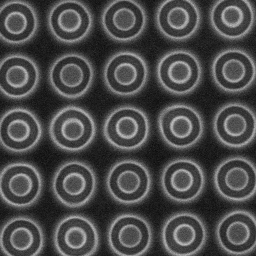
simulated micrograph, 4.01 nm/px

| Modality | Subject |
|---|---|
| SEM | an array of small figures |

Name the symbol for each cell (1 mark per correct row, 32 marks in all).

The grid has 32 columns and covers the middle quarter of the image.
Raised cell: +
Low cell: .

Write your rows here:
+++...+++++...+++...++++...++++.
++++..+++++..+++++..++++...++++.
++++...+++...+++++..++++...++++.
++++...++++..+++++..++++...++++.
++++..+++++...+++...+++++.......
.++...+++++........+++++++......
.....++++++++.....+++++++++....+
....++++++++++++++++++++++++++++
++++++++++++++++++++++++++++++++
++++++++++++++++++++++++++++++++
++++++++++++++++++++++++++++++++
....+++++++++++...++++++++.....+
.....++++++++......++++++.......
......+++++.........++++....++..
.++....++++...++++..++++...++++.
+++++..++++..+++++...+++...+++++
+++++..+++...+++++...++++..+++++
++++...++++...++++..+++++...+++.
.+++..+++++.........++++++......
......++++++.......++++++++.....
.....+++++++++....+++++++++++.++
++++++++++++++++++++++++++++++++
++++++++++++++++++++++++++++++++
++++++++++++++++++++++++++++++++
+++++++++++++++++++++++++++++.++
+....++++++++......++++++++.....
......++++++........++++++......
.......+++++..++++...++++...+++.
++++...++++...+++++..++++..+++++
+++++..++++..++++++..++++..+++++
+++++..++++...+++++..++++...++++
++++...+++++..++++...+++++......